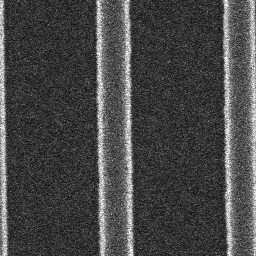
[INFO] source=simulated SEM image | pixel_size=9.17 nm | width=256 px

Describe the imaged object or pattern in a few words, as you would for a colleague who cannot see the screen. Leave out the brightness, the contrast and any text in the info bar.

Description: one or a few lines or trenches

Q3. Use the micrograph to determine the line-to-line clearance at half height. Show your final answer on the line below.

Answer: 0.889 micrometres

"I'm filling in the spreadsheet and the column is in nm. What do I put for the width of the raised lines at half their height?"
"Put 267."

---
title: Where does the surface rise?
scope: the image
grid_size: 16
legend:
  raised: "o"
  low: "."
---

......oo......oo
......oo......oo
......oo......oo
......oo......oo
......oo......oo
......oo......oo
......oo......oo
......oo......oo
......oo......oo
......oo......oo
......oo......oo
......oo......oo
......oo......oo
......oo......oo
......oo......oo
......oo......oo